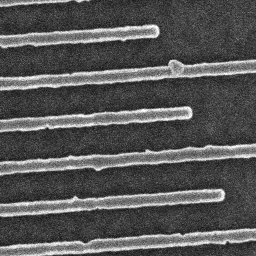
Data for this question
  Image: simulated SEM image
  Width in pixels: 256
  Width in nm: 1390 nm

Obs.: parallel lines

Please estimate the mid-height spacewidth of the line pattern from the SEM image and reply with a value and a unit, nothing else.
167 nm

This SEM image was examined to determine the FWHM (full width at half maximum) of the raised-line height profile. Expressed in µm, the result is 0.0596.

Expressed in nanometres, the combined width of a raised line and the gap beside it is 229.